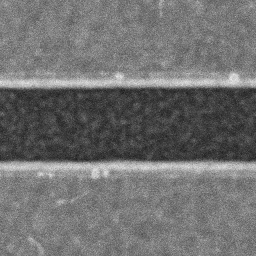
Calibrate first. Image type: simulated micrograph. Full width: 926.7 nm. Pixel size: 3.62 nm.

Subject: one or a few lines or trenches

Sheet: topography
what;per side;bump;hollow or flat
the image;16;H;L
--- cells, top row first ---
HHHHHHHHHHHHHHHH
HHHHHHHHHHHHHHHH
HHHHHHHHHHHHHHHH
HHHHHHHHHHHHHHHH
HHHHHHHHHHHHHHHH
LLLLLLLLLLLLLLLL
LLLLLLLLLLLLLLLL
LLLLLLLLLLLLLLLL
LLLLLLLLLLLLLLLL
LLLLLLLLLLLLLLLL
HHHHHHHHHHHHHHHH
HHHHHHHHHHHHHHHH
HHHHHHHHHHHHHHHH
HHHHHHHHHHHHHHHH
HHHHHHHHHHHHHHHH
HHHHHHHHHHHHHHHH